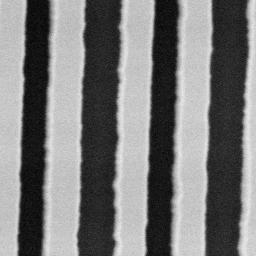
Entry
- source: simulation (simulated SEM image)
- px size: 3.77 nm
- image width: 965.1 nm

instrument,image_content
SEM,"lines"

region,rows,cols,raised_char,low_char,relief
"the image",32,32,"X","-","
XXX---XXXXX----XXXX---XXXX-----X
XXX---XXXXX----XXXX----XXX-----X
XXX---XXXXX----XXXX---XXXX-----X
XXX---XXXXX----XXXX---XXXXX----X
XXX---XXXX-----XXXX---XXXX-----X
XXX---XXXX-----XXXX---XXXX-----X
XXX---XXXXX----XXXX---XXXX-----X
XXX---XXXXX----XXXX---XXXX-----X
XXX---XXXX-----XXXX---XXXX-----X
XXX---XXXX-----XXXX---XXXX-----X
XXX---XXXX-----XXXX---XXXX-----X
XXX---XXXX-----XXXX---XXXX-----X
XXX---XXXX-----XXXX---XXXX-----X
XXX---XXXX-----XXXX---XXXX-----X
XXX---XXXX-----XXXX---XXXX-----X
XXX---XXXX-----XXXX---XXXX-----X
XXX---XXXX-----XXXX---XXXX-----X
XXX---XXXX-----XXXX---XXXX-----X
XXX---XXXX-----XXXX---XXXX-----X
XXX---XXXX-----XXXX---XXXX-----X
XXX---XXXX-----XXXX---XXXX-----X
XX----XXXX-----XXX----XXXX-----X
XX----XXXX-----XXX----XXXX-----X
XX----XXXX----XXXX----XXXX----XX
XX----XXXX-----XXX----XXXX----XX
XX----XXXX----XXXX----XXXX----XX
XX----XXXX-----XXX----XXXX----XX
XX----XXXX-----XXX----XXXX----XX
XX----XXXX-----XXX----XXXX----XX
XX----XXXX----XXXX----XXXX----XX
XX---XXXXX-----XXX----XXXX----XX
XX---XXXXX----XXXX----XXXX----XX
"